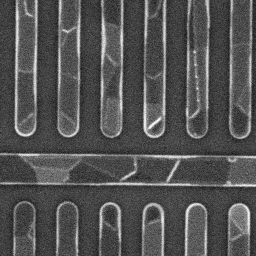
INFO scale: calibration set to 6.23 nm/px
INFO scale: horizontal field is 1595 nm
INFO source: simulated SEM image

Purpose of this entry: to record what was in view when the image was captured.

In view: groups of lines, slits or small figures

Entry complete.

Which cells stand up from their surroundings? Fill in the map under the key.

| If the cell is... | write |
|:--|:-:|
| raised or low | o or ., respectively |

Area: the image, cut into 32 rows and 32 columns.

..ooo...oo...oo...ooo...oo...oo.
..ooo..ooo...oo...ooo...oo...oo.
..ooo..ooo...oo...ooo...oo...oo.
..ooo..ooo...oo...ooo...oo...oo.
..ooo..ooo...oo...ooo...oo...oo.
..ooo..ooo...oo...ooo...oo...oo.
..oo...ooo...oo...ooo...oo...oo.
..oo...ooo...oo...ooo...oo...oo.
..oo...ooo...oo...ooo...oo...oo.
..oo...ooo...oo...ooo...oo...oo.
..oo...ooo...oo...ooo..ooo...oo.
..oo...ooo...oo...ooo..ooo...oo.
..oo...ooo...oo...oo...ooo...oo.
..oo...ooo...oo...oo...ooo...oo.
..oo...ooo...oo...oo...ooo...oo.
..oo...ooo...oo...oo...ooo...oo.
..oo....oo...oo...oo....oo...oo.
................................
................................
ooooooooooooooo.................
oooooooooooooooooooooooooooooooo
oooooooooooooooooooooooooooooooo
oooooooooooooooooooooooooooooooo
................................
................................
..oo....o.......................
..oo...ooo...oo...oo...ooo...oo.
..oo...ooo...oo...oo...ooo...oo.
..oo...ooo...oo...oo...ooo...oo.
..oo...ooo..ooo...oo...ooo...oo.
..oo...ooo..ooo...oo...ooo...oo.
..oo...ooo..ooo...oo...ooo...oo.